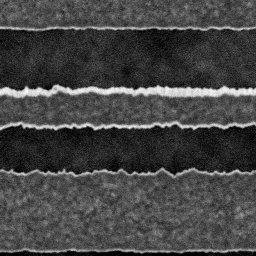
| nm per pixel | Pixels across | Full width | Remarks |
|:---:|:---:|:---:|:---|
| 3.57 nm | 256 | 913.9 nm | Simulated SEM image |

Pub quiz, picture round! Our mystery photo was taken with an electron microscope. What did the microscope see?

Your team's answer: lines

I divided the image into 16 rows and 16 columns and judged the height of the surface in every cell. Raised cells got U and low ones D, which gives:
UUUUUUUUUUUUUUUU
UUUUUUUUUUUUUUUU
DDDDDDDDDDDDDDDD
DDDDDDDDDDDDDDDD
DDDDDDDDDDDDDDDD
DDDDDDDDDDDDDDDD
UUUUUUUUUUUUUUUU
UUUUUUUUUUUUUUUU
DDDDDDDDDDDDDDDD
DDDDDDDDDDDDDDDD
DDDDDDDDDDDDDDDD
UUUUUUUUUUUUUUUU
UUUUUUUUUUUUUUUU
UUUUUUUUUUUUUUUU
UUUUUUUUUUUUUUUU
UUUUUUUUUUUUUUUU